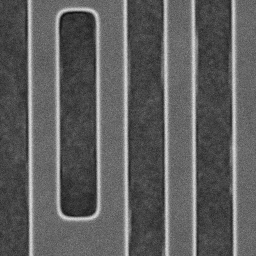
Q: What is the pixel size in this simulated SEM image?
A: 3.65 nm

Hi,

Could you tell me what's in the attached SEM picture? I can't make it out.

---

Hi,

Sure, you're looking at groups of lines, slits or small figures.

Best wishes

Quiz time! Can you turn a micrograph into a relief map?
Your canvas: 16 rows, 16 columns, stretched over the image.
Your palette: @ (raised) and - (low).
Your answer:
--@@@@@@--@@---@
--@@--@@--@@---@
--@@--@@--@@---@
--@@--@@--@@---@
--@@--@@--@@---@
--@@--@@--@@---@
--@@--@@--@@---@
--@@--@@--@@---@
--@@--@@--@@---@
--@@--@@--@@---@
--@@--@@--@@---@
--@@--@@--@@---@
--@@--@@--@@---@
--@@--@@--@@---@
--@@@@@@--@@---@
--@@@@@@--@@---@